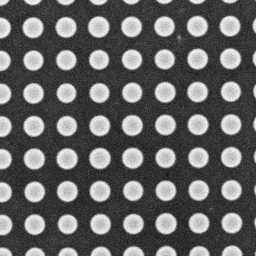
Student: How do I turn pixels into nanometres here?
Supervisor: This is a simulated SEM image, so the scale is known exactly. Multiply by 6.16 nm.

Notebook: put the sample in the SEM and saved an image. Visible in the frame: an array of small figures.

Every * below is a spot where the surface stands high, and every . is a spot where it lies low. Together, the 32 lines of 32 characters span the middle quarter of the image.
**.....***.....****....****.....
................................
................................
................................
................................
**.....***.....****....****....*
***....****....****....*****...*
***....****....****....*****...*
***....****....****....****....*
*.......*.......................
................................
................................
................................
**.....***.....****.....***.....
***....****....****....*****...*
***....****....****....*****...*
***....****....****....****.....
**......**......**......**......
................................
................................
................................
**......**......***.....***.....
***....****....****....*****...*
***...*****....****....*****...*
***....****....****....*****...*
**.....****.....***.....***.....
................................
................................
................................
**......**..............***.....
***....****....****....****....*
***....****....*****...*****...*